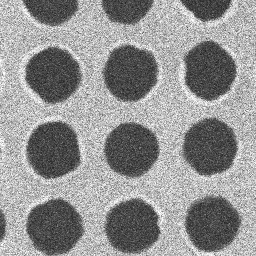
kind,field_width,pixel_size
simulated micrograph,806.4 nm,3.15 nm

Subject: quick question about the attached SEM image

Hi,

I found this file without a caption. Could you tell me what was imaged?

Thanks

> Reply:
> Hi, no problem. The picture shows a regular array of holes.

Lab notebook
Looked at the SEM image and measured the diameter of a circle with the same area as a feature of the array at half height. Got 172 nm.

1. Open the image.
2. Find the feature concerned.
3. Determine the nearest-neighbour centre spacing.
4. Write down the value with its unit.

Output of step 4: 241 nanometers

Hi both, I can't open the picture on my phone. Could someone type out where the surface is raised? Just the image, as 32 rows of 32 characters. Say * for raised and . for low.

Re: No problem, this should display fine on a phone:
***.......***......****......***
****......***.....******....****
*****...******....*******..*****
********************************
********************************
*************************..*****
*****...******.....*****....****
****.....****......****......***
***.......***.......***......***
***.......***.......***......***
****......***......****......***
****.....*****.....*****....****
*****...*******..*********.*****
********************************
********************************
*****...*******...******....****
****.....*****.....****......***
***.......***.......***.......**
***.......***.......***.......**
****......***.......***......***
****......***......*****.....***
*****....*****....*******...****
********************************
********************************
********************************
*****....******....*****.....***
****......****......***.......**
.**.......***.......***.......**
.**.......***.......***.......**
****......***.......****.....***
****.....*****.....*****.....***
*****...*******...**************